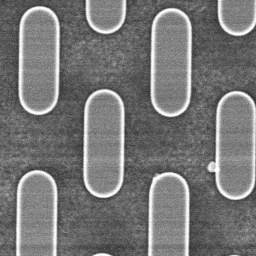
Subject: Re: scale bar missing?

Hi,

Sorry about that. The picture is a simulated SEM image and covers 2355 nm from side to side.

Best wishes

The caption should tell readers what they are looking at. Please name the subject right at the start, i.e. groups of lines, slits or small figures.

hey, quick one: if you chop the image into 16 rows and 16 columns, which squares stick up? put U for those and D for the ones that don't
DDDDDUUUDDDDDDUU
DUUUDDUUDDUUDDUU
DUUUDDDDDDUUDDDD
DUUUDDDDDUUUDDDD
DUUUDDDDDUUUDDDD
DUUUDDDDDUUUDDDD
DUUDDUUUDDUUDDUU
DDDDDUUUDDDDDDUU
DDDDDUUUDDDDDDUU
DDDDDUUUDDDDDDUU
DDDDDUUUDDDDDDUU
DUUDDUUUDDUUDDUU
DUUDDDDDDUUUDDDD
DUUDDDDDDUUUDDDD
DUUDDDDDDUUUDDDD
DUUDDDDDDUUUDDDD